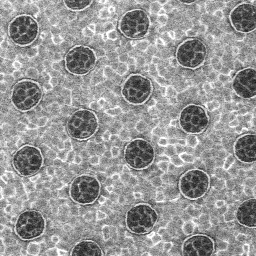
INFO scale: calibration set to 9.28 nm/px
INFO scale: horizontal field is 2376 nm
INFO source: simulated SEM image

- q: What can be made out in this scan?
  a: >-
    a regular array of raised bodies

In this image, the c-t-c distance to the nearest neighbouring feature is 592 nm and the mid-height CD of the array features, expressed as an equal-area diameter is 0.285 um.